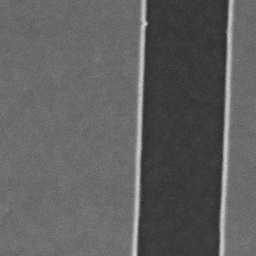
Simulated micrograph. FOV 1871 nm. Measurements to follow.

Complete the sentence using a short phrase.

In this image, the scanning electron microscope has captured one or a few lines or trenches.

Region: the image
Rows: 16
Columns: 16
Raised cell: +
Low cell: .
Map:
+++++++++.....++
+++++++++.....++
+++++++++.....++
+++++++++.....++
+++++++++.....++
+++++++++.....++
+++++++++.....++
+++++++++.....++
+++++++++.....++
+++++++++.....++
+++++++++.....++
+++++++++.....++
+++++++++.....++
+++++++++.....++
++++++++......++
++++++++......++